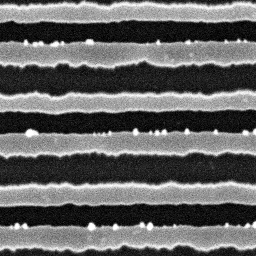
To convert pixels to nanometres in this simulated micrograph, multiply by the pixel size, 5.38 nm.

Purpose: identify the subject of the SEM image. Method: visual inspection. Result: lines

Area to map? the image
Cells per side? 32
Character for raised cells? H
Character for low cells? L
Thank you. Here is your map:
LLLLLLLLLLLLLLLLLLLLLLLLLLLLLLLL
HHHHHHHHHHHHHHHHHHHHHHHHHHHHHHHH
HHHHHHHHHHHHHHHHLHHHHHHHHHHHHHLH
LLLLLLLLLLLLLLLLLLLLLLLLLLLLLLLL
LLLLLLLLLLLLLLLLLLLLLLLLLLLLLLLL
HHHHHHHHHHHHHHHHHLLHHHHHHHHHHHHH
HHHHHHHHHHHHHHHHHHHHHHHHHHHHHHHH
HHHHHHHHHHHHHHHHHHHHHHHHHHHHHHHH
LLLLLLLLLLLLLLLLLLLLLLLLLLLLLLLL
LLLLLLLLLLLLLLLLLLLLLLLLLLLLLLLL
LLLLLLLLLLLLLLLLLLLLLLLLLLLLLLLL
LLLLLLLLLLLLLLLLLLLLLLLLLLLLLLLL
HHHHHHHHHHHHHHHHHHHHHHHHHHHHHHHH
HHHHHHHHHHHHHHHHHHHHHHHHHHHHHHHH
LLLLLLLLLLLLLLLLLLLLLLLLLLLLLLLL
LLLLLLLLLLLLLLLLLLLLLLLLLLLLLLLL
LLLHHLLLLLLLLLLLHLLLHLLHLLLLLLHH
HHHHHHHHHHHHHHHHHHHHHHHHHHHHHHHH
HHHHHHHHHHHHHHHHHHHHHHHHHHHHHHHH
LLLLLLLLLLLLLLLLLLLLLLLLLLLLLLLL
LLLLLLLLLLLLLLLLLLLLLLLLLLLLLLLL
LLLLLLLLLLLLLLLLLLLLLLLLLLLLLLLL
LLLLLLLLLLLLLLLLLLLLLLLLLLLLLLLL
LHHHHHHHHHHHHHHHHHHHHHHHHHHHHHHH
HHHHHHHHHHHHHHHHHHHHHHHHHHHHHHHH
HHHHHHHHLHHHHHHHLLLHLLLLLLLLLLLH
LLLLLLLLLLLLLLLLLLLLLLLLLLLLLLLL
LLLLLLLLLLLLLLLLLLLLLLLLLLLLLLLL
HHHHHHHHHHHHHHHHHHHHHHHHHHHHHHHH
HHHHHHHHHHHHHHHHHHHHHHHHHHHHHHHH
HHHHHHHHHHHHHHHHHHHHHHLHHHHHHHHH
LLLLLLLLLLLLLLLLLLLLLLLLLLLLLLLL